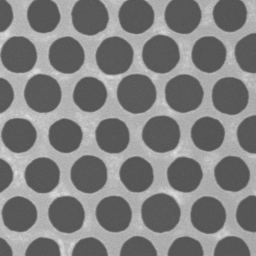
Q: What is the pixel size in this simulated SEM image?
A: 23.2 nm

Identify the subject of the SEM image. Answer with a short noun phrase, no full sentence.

a regular array of holes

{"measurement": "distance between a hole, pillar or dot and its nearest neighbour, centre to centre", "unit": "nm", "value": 1050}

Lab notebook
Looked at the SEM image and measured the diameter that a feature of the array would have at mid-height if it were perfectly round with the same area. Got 853 nm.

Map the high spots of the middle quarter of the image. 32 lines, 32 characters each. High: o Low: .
....oooo.........ooo........oooo
....ooooo.......oooooo.....ooooo
oooooooooo....ooo..ooooo.ooooooo
oooo....ooooooo......oooooo.....
ooo......ooooo........oooo......
ooo.......ooo..........oo.......
oo.........oo..........oo.......
oo.........oo..........oo.......
oo.........oo..........oo.......
ooo.......oooo.........ooo......
ooo.......oooo........oooo......
oooo.....oooooo......oooooo.....
ooooooooooooooooo..ooooooooooooo
ooooooooooo..ooooooooo.....ooooo
...oooooo......oooooo.......oooo
....oooo........oooo.........ooo
....oooo........oooo.........ooo
.....ooo........ooo..........oo.
.....ooo.........oo..........ooo
....oooo........oooo.........ooo
....ooooo.......ooooo.......oooo
...oooooo......ooooooo.....ooooo
ooooooooooo.oooooooooooooooooooo
oooo.....ooooooo....oooooooo....
ooo.......ooooo......oooooo.....
oo.........ooo........oooo......
o..........ooo........oooo......
o..........ooo........oooo......
o..........ooo........oooo......
oo.........ooo........oooo......
ooo.......ooooo.......ooooo.....
ooo......ooooooo.....ooooooo....